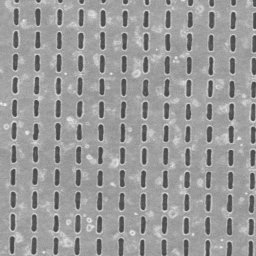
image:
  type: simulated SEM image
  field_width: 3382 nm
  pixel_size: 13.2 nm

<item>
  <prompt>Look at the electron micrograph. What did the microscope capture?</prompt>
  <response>a regular array of holes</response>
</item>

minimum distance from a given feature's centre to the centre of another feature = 284 nm